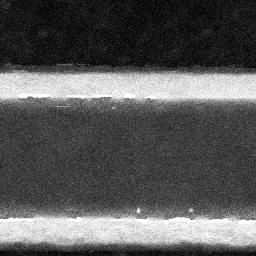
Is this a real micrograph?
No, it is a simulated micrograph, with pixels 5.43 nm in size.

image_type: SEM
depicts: one or a few lines or trenches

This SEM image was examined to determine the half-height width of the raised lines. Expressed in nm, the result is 768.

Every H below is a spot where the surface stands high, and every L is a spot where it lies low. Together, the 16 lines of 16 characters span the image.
LLLLLLLLLLLLLLLL
LLLLLLLLLLLLLLLL
LLLLLLLLLLLLLLLL
LLLLLLLLLLLLLLLL
LLLLLLLLLLLLLLLL
HLHHHHHHLHHHLLLL
HHHHHHHHHHHHHHHH
HHHHHHHHHHHHHHHH
HHHHHHHHHHHHHHHH
HHHHHHHHHHHHHHHH
HHHHHHHHHHHHHHHH
HHHHHHHHHHHHHHHH
HHHHHHHHHHHHHHHH
HHHHHHHHHHHHHHHH
LLLLLLLLLLLLLLLL
LLLLLLLLLLLLLLLL